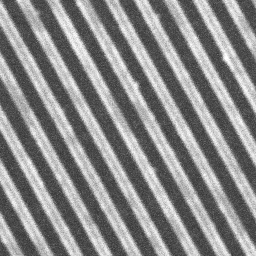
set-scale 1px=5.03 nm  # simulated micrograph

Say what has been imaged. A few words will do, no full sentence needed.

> parallel lines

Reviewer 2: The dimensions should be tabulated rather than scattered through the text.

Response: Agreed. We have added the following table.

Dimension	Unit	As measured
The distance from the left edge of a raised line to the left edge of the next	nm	129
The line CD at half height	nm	51.2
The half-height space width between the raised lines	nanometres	78.7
